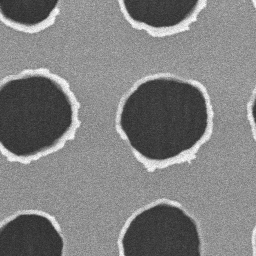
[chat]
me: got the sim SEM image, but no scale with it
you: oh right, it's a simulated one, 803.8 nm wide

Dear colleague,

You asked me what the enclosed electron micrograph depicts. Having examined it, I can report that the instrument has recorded holes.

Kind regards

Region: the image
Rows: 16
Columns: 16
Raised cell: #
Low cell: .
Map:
...#####....####
#.#######..#####
################
################
################
....#####...####
....####.....###
....####.....###
....####.....###
#.#######..#####
################
################
################
#..######...####
....####....####
....####.....###